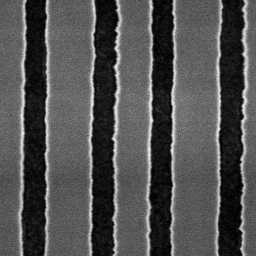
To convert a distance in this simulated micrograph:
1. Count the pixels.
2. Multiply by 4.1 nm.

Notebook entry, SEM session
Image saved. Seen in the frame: lines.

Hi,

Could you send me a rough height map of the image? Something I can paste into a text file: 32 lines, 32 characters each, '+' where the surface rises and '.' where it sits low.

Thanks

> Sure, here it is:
+++...++++++...++++...++++++...+
+++...++++++...++++...++++++..++
+++...++++++...++++...++++++...+
+++...++++++...++++...++++++..++
+++...++++++...++++...++++++..++
+++...++++++..+++++...+++++...++
+++...++++++..+++++...++++++..++
+++...++++++...++++...+++++....+
+++...++++++..+++++...+++++....+
+++...++++++..+++++...+++++...++
+++...++++++...++++...++++++...+
+++...++++++..+++++..+++++++..++
+++...++++++..+++++..+++++++..++
+++...++++++..+++++...++++++..++
+++...++++++..+++++..+++++++..++
+++...++++++..+++++...++++++..++
+++...+++++...+++++..++++++...++
+++...+++++...+++++..++++++...++
+++...+++++...+++++..++++++...++
+++...+++++...+++++..++++++...++
+++...+++++...+++++..+++++++..++
+++...+++++...+++++..+++++++..++
+++...+++++...+++++..+++++++..++
+++...+++++...+++++...++++++..++
+++...+++++...+++++..+++++++..++
+++...+++++...+++++..+++++++..++
+++...+++++...+++++..++++++...++
+++...+++++...+++++..++++++...++
+++...+++++...+++++..++++++...++
+++...+++++...+++++..++++++...++
+++...+++++...+++++..++++++...++
+++...+++++...+++++..++++++...++